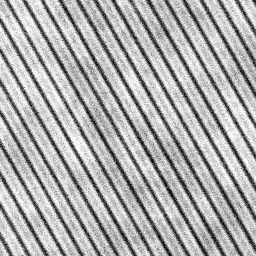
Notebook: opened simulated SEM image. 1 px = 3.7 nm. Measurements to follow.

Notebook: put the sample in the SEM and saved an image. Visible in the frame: parallel lines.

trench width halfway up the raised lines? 4.78 pixels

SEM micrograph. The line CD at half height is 38.9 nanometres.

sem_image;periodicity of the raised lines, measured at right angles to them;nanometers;56.8